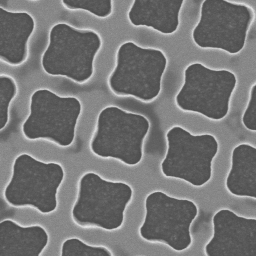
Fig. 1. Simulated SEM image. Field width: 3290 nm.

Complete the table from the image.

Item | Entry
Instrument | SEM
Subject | a regular array of holes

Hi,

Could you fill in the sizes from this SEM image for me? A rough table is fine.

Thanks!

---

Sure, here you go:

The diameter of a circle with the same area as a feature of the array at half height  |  694 nanometers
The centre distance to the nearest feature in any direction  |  866 nm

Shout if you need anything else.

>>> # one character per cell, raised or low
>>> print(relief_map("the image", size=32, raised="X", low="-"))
XXXXXXXX------XXX------XX----XXX
-XXXXXXXXXX---XX------XXX------X
----XXXXXXXXXXXX------XXX------X
----XXX--XXXXXXXXXX---XX-------X
----XX------XXXXXXXXXXXX-------X
---XXX------XXXX-XXXXXXXX-----XX
---XXX------XXX-----XXXXXXXXX-XX
X--XX-------XXX------XXXXXXXXXXX
XXXXXX------XX-------XX---XXXXXX
XXXXXXXX---XXX------XXX------XXX
--XXXXXXXXXXXX------XXX------XXX
--XXX-XXXXXXXX------XX-------XX-
-XXX------XXXXXXXXXXXX-------XX-
-XXX------XXXX-XXXXXXXX------XX-
-XXX------XX------XXXXXXXX--XX--
-XX------XXX-------XXXXXXXXXXXX-
XXX------XXX------XXX--XXXXXXXXX
XXXXXXX--XXX------XXX------XXXXX
XXXXXXXXXXXX------XXX------XXX--
XX--XXXXXXXXX-----XXX------XX---
XX-----XXXXXXXXX-XXX------XXX---
XX------XXXXXXXXXXXX------XXX---
X-------XX---XXXXXXXXXX---XX----
X------XXX------XXXXXXXXXXXXX---
X------XXX------XXX--XXXXXXXXXX-
XX-----XX-------XX------XXXXXXXX
XXXXXXXXX------XXX-------XX--XXX
XXXXXXXXX------XXX------XXX-----
-----XXXXXXXX-XXXX------XXX-----
------XXXXXXXXXXXX------XXX-----
------XX---XXXXXXXXXX---XX------
-----XXX------XXXXXXXXXXXX------